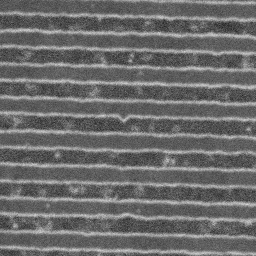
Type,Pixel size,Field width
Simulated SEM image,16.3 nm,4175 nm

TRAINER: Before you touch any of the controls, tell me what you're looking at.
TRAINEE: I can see parallel lines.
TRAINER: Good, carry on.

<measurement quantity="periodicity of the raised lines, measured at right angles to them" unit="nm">546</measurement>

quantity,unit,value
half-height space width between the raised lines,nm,275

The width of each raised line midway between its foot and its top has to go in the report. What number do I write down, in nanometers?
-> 273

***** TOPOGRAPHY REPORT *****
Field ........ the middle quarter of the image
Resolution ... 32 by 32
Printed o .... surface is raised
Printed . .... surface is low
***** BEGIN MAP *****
o...o...oo......................
oooooooooooooooooooooooooooooooo
oooooooooooooooooooooooooooooooo
oooooooooooooooooooooooooooooooo
..ooooooo.oooooooooooooooooooooo
................................
................................
................................
................................
ooooooooooooooo.ooooooo........o
oooooooooooooooooooooooooooooooo
oooooooooooooooooooooooooooooooo
oooooooooooooooooooooooooooooooo
..............oo..........ooo..o
................................
................................
................................
ooooooooo..oooo.................
oooooooooooooooooooooooooooooooo
oooooooooooooooooooooooooooooooo
oooooooooooooooooooooooooooooooo
..........o.oooooooooo..oooooooo
................................
................................
................................
ooo.....ooo.....................
oooooooooooooooooooooooooooooooo
oooooooooooooooooooooooooooooooo
oooooooooooooooooooooooooooooooo
oo..oooooooooooooooooooooooooooo
................................
................................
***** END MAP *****